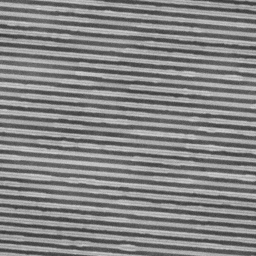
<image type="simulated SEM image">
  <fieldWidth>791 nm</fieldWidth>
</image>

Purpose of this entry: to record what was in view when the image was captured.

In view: parallel lines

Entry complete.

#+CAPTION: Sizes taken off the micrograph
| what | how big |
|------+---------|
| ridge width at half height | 15.8 nm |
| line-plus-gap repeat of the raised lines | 27.6 nanometres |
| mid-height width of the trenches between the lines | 13.1 nm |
